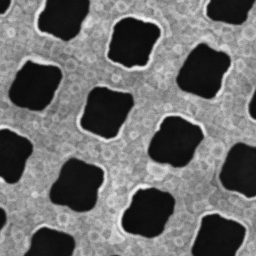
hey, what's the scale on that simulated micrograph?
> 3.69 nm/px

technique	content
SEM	holes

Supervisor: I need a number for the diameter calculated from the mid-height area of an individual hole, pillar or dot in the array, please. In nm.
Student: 185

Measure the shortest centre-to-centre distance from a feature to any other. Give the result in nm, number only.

279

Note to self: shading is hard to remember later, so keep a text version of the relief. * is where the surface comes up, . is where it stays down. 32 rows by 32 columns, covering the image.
.*****.....***************......
.****......***************.....*
*****.....*****...*********....*
*****.....****......************
*******..*****......************
**************.....******.******
*************......*****....****
**************.....****......***
***....****************......***
**......**************......****
*......***************......****
*......****....********....*****
*.....*****......**************.
***...*****.....***************.
**********......*****.*********.
**********.....*****....********
..*********....*****.....*******
....***************......*******
....***************......****...
....***************.....****....
...*****...**********..*****....
...****......***************....
*.*****......**************.....
******......****************....
******......*****.....*********.
*******.....****......**********
.***************......**********
.**************......****....***
*****.*********......****......*
****.....*********..*****......*
****.....***************......**
***......***************......**